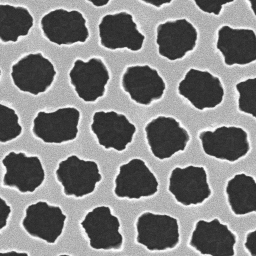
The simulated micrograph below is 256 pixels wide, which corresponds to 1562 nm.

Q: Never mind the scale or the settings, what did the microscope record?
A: a regular array of holes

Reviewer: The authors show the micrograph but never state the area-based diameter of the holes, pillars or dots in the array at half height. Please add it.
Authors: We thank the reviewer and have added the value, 245 nm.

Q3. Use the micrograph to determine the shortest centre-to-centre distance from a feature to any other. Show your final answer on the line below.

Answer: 336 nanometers